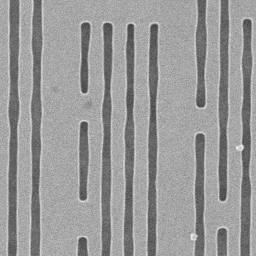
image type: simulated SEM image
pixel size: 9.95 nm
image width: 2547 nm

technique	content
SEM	groups of lines, slits or small figures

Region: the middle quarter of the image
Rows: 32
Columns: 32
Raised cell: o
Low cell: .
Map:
oooo..oooo..ooo...ooo...oooooooo
oooo..oooo..ooo...ooo...oooooooo
oooo..oooo..ooo...ooo...oooooooo
oooo..oooo..ooo...ooo...oooooooo
oooo..oooo..ooo...ooo...oooooooo
oooo..oooo..ooo...ooo...oooooooo
oooo..oooo..ooo...ooo...oooooooo
oooooooooo..ooo...ooo..ooooooooo
oooooooooo..ooo...ooo..ooooooooo
oooooooooo..ooo...ooo..ooooooooo
oooooooooo..ooo..oooo..ooooooooo
ooooooooo...ooo..oooo..ooooooooo
ooooooooo...ooo..oooo..ooooooooo
ooooooooo...ooo...ooo..ooooooooo
oooo..oooo..ooo...ooo..ooooooooo
oooo..oooo..ooo...ooo..ooooooooo
oooo..oooo..ooo...ooo..ooooooooo
oooo..oooo..ooo...ooo...oooooooo
oooo..oooo..ooo...ooo...oooooooo
oooo..oooo..ooo...ooo...oooooooo
oooo..oooo..ooo...ooo...oooooooo
oooo..oooo..ooo...ooo...oooooooo
oooo...oo...ooo...ooo...oooooooo
oooo...oo...ooo...ooo...oooooooo
oooo..ooo...ooo...ooo..ooooooooo
oooo..ooo...ooo...ooo..ooooooooo
oooo..ooo...ooo...ooo..ooooooooo
oooo..ooo...ooo...ooo..ooooooooo
oooo..ooo...ooo..oooo..ooooooooo
oooo..ooo...ooo..oooo..ooooooooo
oooo..ooo...ooo..oooo..ooooooooo
oooo..ooo...ooo..oooo..ooooooooo